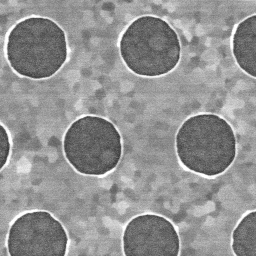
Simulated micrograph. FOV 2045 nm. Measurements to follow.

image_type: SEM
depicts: holes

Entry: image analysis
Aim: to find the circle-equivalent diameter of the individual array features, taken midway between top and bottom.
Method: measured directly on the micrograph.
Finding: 0.487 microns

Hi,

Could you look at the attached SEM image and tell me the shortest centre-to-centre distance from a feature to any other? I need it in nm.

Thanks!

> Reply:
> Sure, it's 899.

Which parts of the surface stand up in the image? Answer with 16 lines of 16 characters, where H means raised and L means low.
HHHHHHHHHHHHHHHH
HLLHHHHHLLHHHHHL
LLLLHHHHLLLHHHHL
LLLLHHHHLLLHHHHL
HLLHHHHHLLHHHHHL
HHHHHHHHHHHHHHHH
HHHHHHHHHHHHHHHH
HHHHHLLHHHHHLLHH
LHHHLLLHHHHLLLLH
LHHHLLLLHHHLLLLH
HHHHHLLHHHHHLLHH
HHHHHHHHHHHHHHHH
HHHHHHHHHHHHHHHH
HLLHHHHHHLHHHHHL
HLLLHHHHLLLHHHHL
LLLLHHHHLLLHHHHL